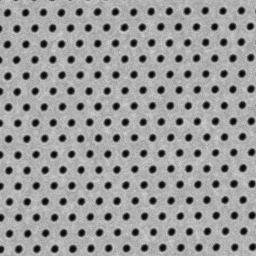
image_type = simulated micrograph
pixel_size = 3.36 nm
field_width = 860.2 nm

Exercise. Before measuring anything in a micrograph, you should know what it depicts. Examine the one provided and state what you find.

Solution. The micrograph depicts a regular array of holes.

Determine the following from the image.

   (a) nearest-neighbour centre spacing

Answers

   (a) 58.9 nanometres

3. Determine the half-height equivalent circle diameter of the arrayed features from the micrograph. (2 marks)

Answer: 26.3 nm